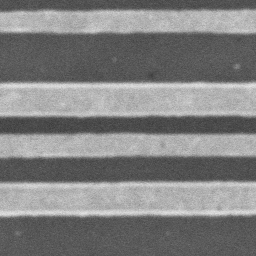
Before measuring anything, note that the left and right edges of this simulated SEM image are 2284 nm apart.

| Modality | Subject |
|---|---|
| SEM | lines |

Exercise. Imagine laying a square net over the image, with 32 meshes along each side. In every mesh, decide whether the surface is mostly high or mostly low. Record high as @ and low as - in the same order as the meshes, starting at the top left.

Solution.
--------------------------------
-------------@@@@@@@@@-@@@@@@@@@
@@@@@@@@@@@@@@@@@@@@@@@@@@@@@@@@
@@@@@@@@@@@@@@@@@@@@@@@@@@@@@@@@
--------------------------------
--------------------------------
--------------------------------
--------------------------------
--------------------------------
--------------------------------
--------------------------------
@@@@@@@@@@@@@@@@@@@@@@@@@@@@@@@@
@@@@@@@@@@@@@@@@@@@@@@@@@@@@@@@@
@@@@@@@@@@@@@@@@@@@@@@@@@@@@@@@@
--------------------------------
--------------------------------
--------------------------------
@@@@@@@@@@@@@@@@@@@@@@@@@@@@@@@@
@@@@@@@@@@@@@@@@@@@@@@@@@@@@@@@@
@-@@----------------------------
--------------------------------
--------------------------------
--------------------------------
@@@@@@@@@@@@@@@@@@@@@@@@@@@@@@@@
@@@@@@@@@@@@@@@@@@@@@@@@@@@@@@@@
@@@@@@@@@@@@@@@@@@@@@@@@@@@@@@@@
@@@@@@@@@@@@@@@@@@@@@@@@@@@@@@@@
--------------------------------
--------------------------------
--------------------------------
--------------------------------
--------------------------------